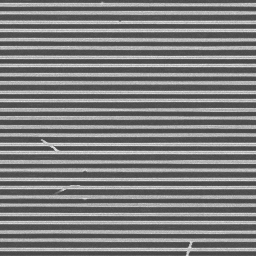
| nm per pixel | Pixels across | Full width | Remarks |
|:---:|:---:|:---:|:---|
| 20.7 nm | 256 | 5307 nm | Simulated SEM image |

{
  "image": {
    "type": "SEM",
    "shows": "parallel lines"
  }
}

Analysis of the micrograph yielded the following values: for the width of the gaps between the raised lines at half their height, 0.109 microns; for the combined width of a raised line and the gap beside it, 181 nanometres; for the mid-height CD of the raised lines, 72.5 nanometers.